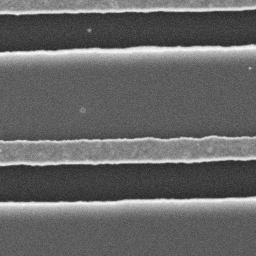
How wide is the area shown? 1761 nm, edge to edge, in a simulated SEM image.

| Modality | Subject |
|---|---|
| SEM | lines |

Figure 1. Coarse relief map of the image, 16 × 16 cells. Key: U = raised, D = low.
UUUUUUUUUUUUUUUU
DDDDDDDDDDDDDDDD
DDDDDDDDDDDDDDDD
UUUUUUUUUUUUUUUU
UUUUUUUUUUUUUUUU
UUUUUUUUUUUUUUUU
UUUUUUUUUUUUUUUU
UUUUUUUUUUUUUUUU
UUUUUUUUUUUUUUUU
UUUUUUUUUUUUUUUU
DDDDDDDDDDDDDDDD
DDDDDDDDDDDDDDDD
DDDDDDDDDDDDUUUU
UUUUUUUUUUUUUUUU
UUUUUUUUUUUUUUUU
UUUUUUUUUUUUUUUU